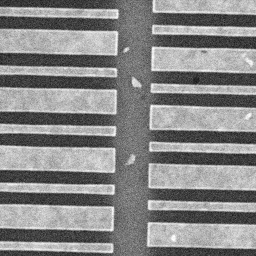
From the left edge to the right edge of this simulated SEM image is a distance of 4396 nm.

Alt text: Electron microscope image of groups of lines, slits or small figures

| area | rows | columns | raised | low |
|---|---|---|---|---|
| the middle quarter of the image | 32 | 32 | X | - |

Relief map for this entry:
----------------------XXXXXXXXXX
XXXXXXXXXXXXX---------XXXXXXXXXX
XXXXXXXXXXXXX-------------------
--------------------------------
--------------------------------
----------------------XXXXXXXXXX
XXXX------------------XXXXXXXXXX
XXXXXXXXXXXXX-------------------
XXXXXXXXXXXXX-------------------
XXXXXXXXXXXXX-------------------
XXXXXXXXXXXXX---------XX--------
XXXXXXXXXXXXX---------XXXXXXXXXX
----------------------XXXXXXXXXX
----------------------XXXXXXXXXX
----------------------XXXXXXXXXX
----------------------XXXXXXXXXX
XXXXXXXXXXXXX-------------------
----XXXXXXXXX-------------------
--------------------------------
--------------------------------
----------------------XXXXXXXXXX
XXXXXXXXXXXXX---------XXXXXXXXXX
XXXXXXXXXXXXX-------------------
XXXXXXXXXXXXX-------------------
XXXXXXXXXXXXX-------------------
XXXXXXXXXXXXX--------XXXXXXXXXXX
XXXXXXXXXXXX---------XXXXXXXXXXX
---------------------XXXXXXXXXXX
---------------------XXXXXXXXXXX
---------------------XXXXXXXXXXX
XXXXXXXXXXXX---------XXXXXXXXXXX
XXXXXXXXXXXX--------------------